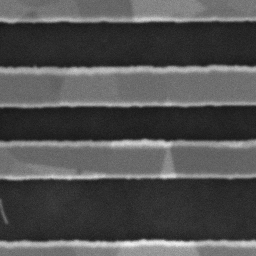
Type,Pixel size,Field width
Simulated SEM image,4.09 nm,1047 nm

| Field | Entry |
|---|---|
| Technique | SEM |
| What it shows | lines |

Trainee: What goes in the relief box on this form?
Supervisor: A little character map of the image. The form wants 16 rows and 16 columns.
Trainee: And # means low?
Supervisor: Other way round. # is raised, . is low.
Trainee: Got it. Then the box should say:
################
................
................
................
################
################
################
................
................
################
################
................
................
................
................
################